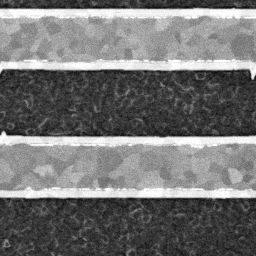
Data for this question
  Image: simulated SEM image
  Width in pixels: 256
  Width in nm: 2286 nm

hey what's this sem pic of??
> one or a few lines or trenches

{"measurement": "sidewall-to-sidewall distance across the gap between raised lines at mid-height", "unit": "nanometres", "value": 663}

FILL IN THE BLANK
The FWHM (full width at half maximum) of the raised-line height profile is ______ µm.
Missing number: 0.483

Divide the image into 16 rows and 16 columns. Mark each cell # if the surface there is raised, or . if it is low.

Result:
................
################
################
################
................
................
................
................
................
################
################
################
................
................
................
................